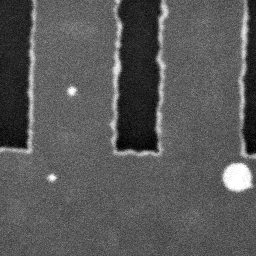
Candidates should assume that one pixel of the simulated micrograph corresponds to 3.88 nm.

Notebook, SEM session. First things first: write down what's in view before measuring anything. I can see one or a few lines or trenches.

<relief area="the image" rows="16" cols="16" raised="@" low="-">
--@@@@@---@@@@@-
--@@@@@---@@@@@-
--@@@@@---@@@@@-
--@@@@@---@@@@@-
--@@@@@---@@@@@-
--@@@@@---@@@@@-
--@@@@@---@@@@@-
--@@@@@---@@@@@-
--@@@@@---@@@@@-
@@@@@@@@-@@@@@@-
@@@@@@@@@@@@@@@@
@@@@@@@@@@@@@@@@
@@@@@@@@@@@@@@@@
@@@@@@@@@@@@@@@@
@@@@@@@@@@@@@@@@
@@@@@@@@@@@@@@@@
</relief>